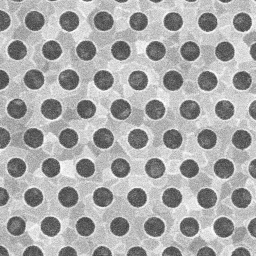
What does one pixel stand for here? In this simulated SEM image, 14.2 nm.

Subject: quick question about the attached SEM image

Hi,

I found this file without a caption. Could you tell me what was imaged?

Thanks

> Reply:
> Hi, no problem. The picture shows a regular array of holes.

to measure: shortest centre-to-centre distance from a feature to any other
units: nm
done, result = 479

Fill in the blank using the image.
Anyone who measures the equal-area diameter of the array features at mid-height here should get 0.296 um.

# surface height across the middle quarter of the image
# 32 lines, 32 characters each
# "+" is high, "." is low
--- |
++++++++++++++++++++++++++++++++
..+++++++.++++++++.+++++++..++++
....++++....++++.....++++....+++
....+++......+++.....++++.....++
....+++......+++.....++++.....++
...+++++....++++.....++++.....++
..+++++++..+++++++..++++++...+++
++++++++++++++++++++++++++++++++
++++++++++++++.+++++++++++++++++
++++...+++++....+++++....+++++..
+++.....++++.....+++.....++++...
+++.....++++.....+++......+++...
+++.....++++.....+++.....++++...
++++...+++++....+++++....+++++..
++++++++++++++++++++++++++++++++
++++++++++++++++++++++++++++++++
...+++++....+++++...++++++..++++
....+++.....++++.....++++....+++
....+++......+++.....++++.....++
....+++.....++++.....++++.....++
...+++++....+++++...+++++....+++
++++++++++++++++++.+++++++++++++
++++++++++++++++++++++++++++++++
++++++++++++++++++++++..++++++++
+++....+++++....+++++....+++++..
+++.....++++.....+++.....++++...
+++.....++++.....+++.....++++...
+++.....++++....+++++....++++...
+++++.++++++++.+++++++..+++++++.
++++++++++++++++++++++++++++++++
++++++++++++++++++++++++++++++++
...+++++....+++++...+++++....+++